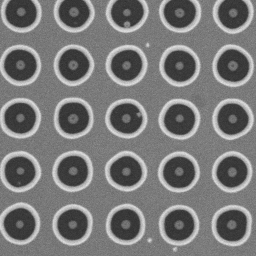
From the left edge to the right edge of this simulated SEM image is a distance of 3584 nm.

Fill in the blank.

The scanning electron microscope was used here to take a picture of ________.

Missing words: an array of small figures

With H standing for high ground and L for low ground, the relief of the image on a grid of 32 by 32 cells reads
HLLLLHHLLLLHHHLLLLHHLLLLLHHLLLLH
LLLLLHHLLLLHHHLLLLHHLLLLLHHLLLLH
HLLLLHHLLLLHHHLLLLHHHLLLLHHLLLLH
HHLLHHHHLLHHHHHLLHHHHHLHHHHHLLHH
HHHHHHHHHHHHHHHHHHHHHHHHHHHHHHHH
HHHHHHHHHHHHHHHHHHHHHHHHHHHHHHHH
HLLLHHHHLLLHHHLLLHHHHLLLHHHHLLHH
LLLLLHHLLLLHHHLLLLHHLLLLLHHLLLLH
LLLLLHHLLLLHHHLLLLHHLLLLLHHLLLLH
HLLLHHHLLLLHHHLLLHHHHLLLHHHLLLLH
HHHHHHHHHHHHHHHHHHHHHHHHHHHHHHHH
HHHHHHHHHHHHHHHHHHHHHHHHHHHHHHHH
HHHHHHHHHHHHHHHHHHHHHHHHHHHHHHHH
HLLLHHHLLLLHHHLLLLHHHLLLHHHLLLLH
LLLLLHHLLLLHHLLLLLHHLLLLLHHLLLLH
LLLLLHHLLLLHHHLLLLHHLLLLLHHLLLLH
HLLLHHHHLLHHHHHLLHHHHLLLHHHLLLHH
HHHHHHHHHHHHHHHHHHHHHHHHHHHHHHHH
HHHHHHHHHHHHHHHHHHHHHHHHHHHHHHHH
HLLHHHHHLLHHHHHLLHHHHHLHHHHHLLHH
HLLLHHHLLLLHHHLLLLHHLLLLHHHLLLLH
LLLLLHHLLLLHHLLLLLHHLLLLLHHLLLLH
HLLLHHHLLLLHHHLLLLHHLLLLHHHLLLLH
HLLHHHHHLLHHHHHHHHHHHLLHHHHHLLHH
HHHHHHHHHHHHHHHHHHHHHHHHHHHHHHHH
HHHHHHHHHHHHHHHHHHHHHHHHHHHHHHHH
HLLLHHHHLLLHHHLLLHHHHLLLHHHHLLLH
LLLLLHHLLLLHHHLLLLHHLLLLHHHLLLLH
LLLLLHHLLLLHHHLLLLHHLLLLLHHLLLLH
HLLLHHHLLLLHHHLLLHHHHLLLHHHLLLLH
HHHHHHHHHHHHHHHHHHHHHHHHHHHHHHHH
HHHHHHHHHHHHHHHHHHHHHHHHHHHHHHHH